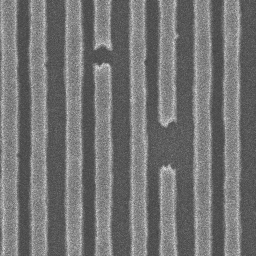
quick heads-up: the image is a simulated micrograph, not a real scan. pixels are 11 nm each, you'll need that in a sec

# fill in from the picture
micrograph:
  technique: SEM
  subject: parallel lines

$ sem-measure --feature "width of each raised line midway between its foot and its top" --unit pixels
16.4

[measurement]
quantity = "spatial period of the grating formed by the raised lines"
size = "351 nm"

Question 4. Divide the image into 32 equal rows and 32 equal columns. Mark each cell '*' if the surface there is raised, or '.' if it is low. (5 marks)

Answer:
**..**..**..**..**..**..**..**..
**..**..**..**..**..**..**..**..
**..**..**..**..**..**..**..**..
**..**..**..**..**..**..**..**..
**..**..**..**..**..**..**..**..
**..**..**..**..**..**..**..**..
**..**..**......**..**..**..**..
**..**..**......**..**..**..**..
**..**..**..**..**..**..**..**..
**..**..**..**..**..**..**..**..
**..**..**..**..**..**..**..**..
**..**..**..**..**..**..**..**..
**..**..**..**..**..**..**..**..
**..**..**..**..**..**..**..**..
**..**..**..**..**..**..**..**..
**..**..**..**..**..*...**..**..
**..**..**..**..**......**..**..
**..**..**..**..**......**..**..
**..**..**..**..**......**..**..
**..**..**..**..**......**..**..
**..**..**..**..**......**..**..
**..**..**..**..**..**..**..**..
**..**..**..**..**..**..**..**..
**..**..**..**..**..**..**..**..
**..**..**..**..**..**..**..**..
**..**..**..**..**..**..**..**..
**..**..**..**..**..**..**..**..
**..**..**..**..**..**..**..**..
**..**..**..**..**..**..**..**..
**..**..**..**...*..**..**..**..
**..**..**..**...*..**..**..**..
**..**..**..**...*..**..**..**..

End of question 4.